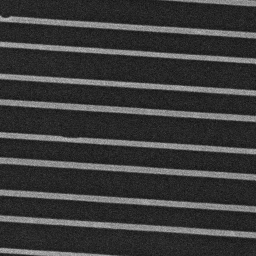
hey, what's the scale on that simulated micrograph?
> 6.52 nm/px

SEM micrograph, parallel lines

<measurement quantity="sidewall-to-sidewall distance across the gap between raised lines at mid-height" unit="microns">0.133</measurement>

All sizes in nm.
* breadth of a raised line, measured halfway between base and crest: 31.7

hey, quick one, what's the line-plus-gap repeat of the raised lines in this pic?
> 28.5 px